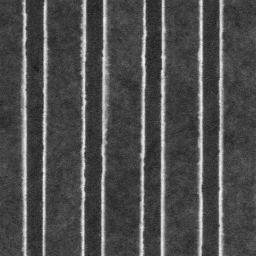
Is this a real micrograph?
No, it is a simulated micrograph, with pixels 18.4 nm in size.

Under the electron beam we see lines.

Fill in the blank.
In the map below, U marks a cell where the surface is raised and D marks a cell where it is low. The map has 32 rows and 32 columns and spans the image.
UUUDDDUUUUUDDUUUUUDDUUUUUDDDUUUU
UUUDDDUUUUUDDUUUUUDDUUUUUDDDUUUU
UUUDDDUUUUUDDUUUUUDDUUUUUDDDUUUU
UUUDDDUUUUUDDUUUUUDDUUUUUDDDUUUU
UUUDDDUUUUUDDUUUUUDDUUUUUDDDUUUU
UUUDDDUUUUUDDUUUUUDDUUUUUDDDUUUU
UUUDDDUUUUUDDUUUUUDDUUUUUDDDUUUU
UUUDDDUUUUUDDUUUUUDDUUUUUDDDUUUU
UUUDDDUUUUUDDUUUUUDDUUUUUDDDUUUU
UUUDDDUUUUDDDUUUUUDDUUUUUDDDUUUU
UUUDDDUUUUUDDUUUUUDDUUUUUDDDUUUU
UUUDDDUUUUUDDUUUUUDDUUUUUDDDUUUU
UUUDDDUUUUUDDUUUUUDDUUUUUDDDUUUU
UUUDDDUUUUUDDUUUUUDDUUUUUDDDUUUU
UUUDDDUUUUUDDUUUUUDDUUUUUDDDUUUU
UUUDDDUUUUUDDUUUUUDDUUUUUDDDUUUU
UUUDDDUUUUUDDUUUUUDDUUUUUDDDUUUU
UUUDDDUUUUUDDUUUUUDDUUUUUDDDUUUU
UUUDDDUUUUDDDUUUUUDDUUUUUDDDUUUU
UUUDDDUUUUDDDUUUUUDDUUUUUDDDUUUU
UUUDDDUUUUDDDUUUUUDDUUUUUDDDUUUU
UUUDDDUUUUDDDUUUUUDDUUUUUDDDUUUU
UUUDDDUUUUDDDUUUUUDDUUUUUDDDUUUU
UUUDDDUUUUDDDUUUUUDDUUUUUDDDUUUU
UUUDDDUUUUDDDUUUUUDDUUUUUDDDUUUU
UUUDDUUUUUDDDUUUUUDDUUUUUDDDUUUU
UUUDDUUUUUDDDUUUUUDDUUUUUDDDUUUU
UUUDDUUUUUDDDUUUUUDDUUUUUDDDUUUU
UUUDDUUUUUDDDUUUUUDDUUUUUDDDUUUU
UUUDDUUUUUDDDUUUUUDDUUUUUDDDUUUU
UUUDDUUUUUDDDUUUUUDDUUUUUDDDUUUU
UUUDDUUUUUDDDUUUUUDDUUUUUDDDUUUU